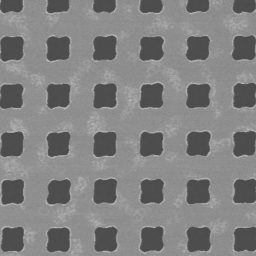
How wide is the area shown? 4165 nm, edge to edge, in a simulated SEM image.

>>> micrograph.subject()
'a regular array of holes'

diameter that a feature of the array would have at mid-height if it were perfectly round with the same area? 419 nanometres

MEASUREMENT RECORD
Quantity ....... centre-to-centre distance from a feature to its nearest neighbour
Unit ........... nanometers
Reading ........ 755